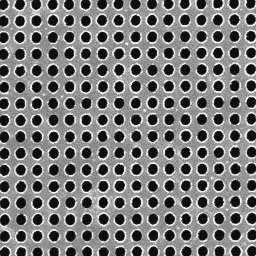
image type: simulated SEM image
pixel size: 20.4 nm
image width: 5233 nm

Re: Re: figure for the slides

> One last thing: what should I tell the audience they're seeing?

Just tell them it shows a regular array of holes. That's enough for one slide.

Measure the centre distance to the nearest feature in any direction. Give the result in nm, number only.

330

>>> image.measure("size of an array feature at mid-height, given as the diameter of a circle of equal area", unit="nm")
219